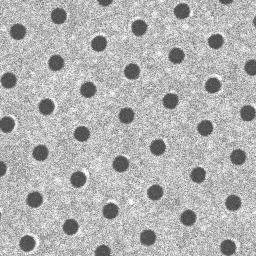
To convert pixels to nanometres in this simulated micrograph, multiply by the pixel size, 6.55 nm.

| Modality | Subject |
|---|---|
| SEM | a regular array of holes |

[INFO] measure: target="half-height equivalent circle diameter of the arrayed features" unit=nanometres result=106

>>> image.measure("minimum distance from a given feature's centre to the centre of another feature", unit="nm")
284